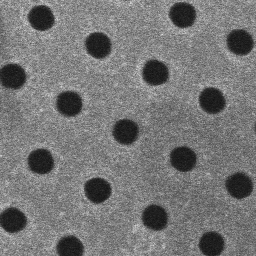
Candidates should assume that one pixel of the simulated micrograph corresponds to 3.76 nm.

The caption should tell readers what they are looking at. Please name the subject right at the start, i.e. a regular array of holes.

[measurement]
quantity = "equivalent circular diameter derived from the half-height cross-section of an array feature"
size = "0.0925 µm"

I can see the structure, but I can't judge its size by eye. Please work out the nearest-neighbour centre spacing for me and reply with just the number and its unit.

237 nm